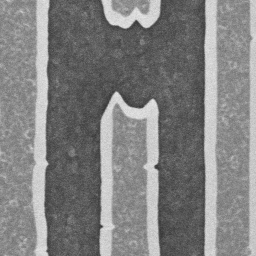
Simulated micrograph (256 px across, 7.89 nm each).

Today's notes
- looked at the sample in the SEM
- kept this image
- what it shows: one or a few lines or trenches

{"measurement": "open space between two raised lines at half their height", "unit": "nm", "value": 496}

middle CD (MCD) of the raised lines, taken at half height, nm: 361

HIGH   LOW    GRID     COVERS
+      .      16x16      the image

+++....+++...+++
+++..........+++
+++..........+++
+++..........+++
+++..........+++
+++..........+++
+++....+.....+++
+++....+++...+++
+++....+++...+++
++.....+++...+++
+++....++....+++
++.....+++...+++
++.....+++...+++
+++....+++...+++
+++....+++...+++
+++....+++...+++